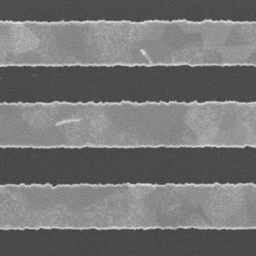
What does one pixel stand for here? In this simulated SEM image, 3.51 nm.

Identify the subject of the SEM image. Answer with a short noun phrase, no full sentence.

lines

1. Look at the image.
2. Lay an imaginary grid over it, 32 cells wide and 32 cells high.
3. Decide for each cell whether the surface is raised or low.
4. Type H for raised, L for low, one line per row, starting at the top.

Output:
LLLLLLLLLLLLLLLLLLLLLLLLLLLLLLLL
LLLLLLLLLLLLLLLLLLLLLLLLLLLLLLLL
LLLLLLLLLLLLLLLLLLLLLLLLLLLLLLLL
HHHHHHHHHHHHHHHHHHHHHHHHHHHHHHHH
HHHHHHHHHHHHHHHHHHHHHHHHHHHHHHHH
HHHHHHHHHHHHHHHHHHHHHHHHHHHHHHHH
HHHHHHHHHHHHHHHHHHHHHHHHHHHHHHHH
HHHHHHHHHHHHHHHHHHHHHHHHHHHHHHHH
LLLLLLLLLLLLLLLLLLLLLLLLLLLLLLLL
LLLLLLLLLLLLLLLLLLLLLLLLLLLLLLLL
LLLLLLLLLLLLLLLLLLLLLLLLLLLLLLLL
LLLLLLLLLLLLLLLLLLLLLLLLLLLLLLLL
LLLLLLLLLLLLLLLLLLLLLLLLLLLLLLLL
HHHHHHHHHHHHHHHHHHHHHHHHHHHHHHHH
HHHHHHHHHHHHHHHHHHHHHHHHHHHHHHHH
HHHHHHHHHHHHHHHHHHHHHHHHHHHHHHHH
HHHHHHHHHHHHHHHHHHHHHHHHHHHHHHHH
HHHHHHHHHHHHHHHHHHHHHHHHHHHHHHHH
LLLLLLLLLLLLLLLLLLLLLLLLLLLLLLLL
LLLLLLLLLLLLLLLLLLLLLLLLLLLLLLLL
LLLLLLLLLLLLLLLLLLLLLLLLLLLLLLLL
LLLLLLLLLLLLLLLLLLLLLLLLLLLLLLLL
LLLLLLLLLLLLLLLLLLLLLLLLLLLLLLLL
HHHHHHHHHHHHHHHHHHHHHHHHHHHHHHHH
HHHHHHHHHHHHHHHHHHHHHHHHHHHHHHHH
HHHHHHHHHHHHHHHHHHHHHHHHHHHHHHHH
HHHHHHHHHHHHHHHHHHHHHHHHHHHHHHHH
HHHHHHHHHHHHHHHHHHHHHHHHHHHHHHHH
HHHHHLHHHHHHHHHHHHHLHHLLLHHHHHHL
LLLLLLLLLLLLLLLLLLLLLLLLLLLLLLLL
LLLLLLLLLLLLLLLLLLLLLLLLLLLLLLLL
LLLLLLLLLLLLLLLLLLLLLLLLLLLLLLLL